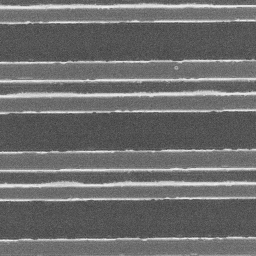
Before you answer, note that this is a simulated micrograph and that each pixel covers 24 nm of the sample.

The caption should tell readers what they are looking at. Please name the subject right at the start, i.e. lines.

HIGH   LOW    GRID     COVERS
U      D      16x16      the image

UUUUUUUUUUUUUUUU
DDDDDDDDDDDDDDDD
DDDDDDDDDDDDDDDD
DDDDDDDDDDDDDDDD
UUUUUUUUUUUUUUUU
UUUUUUUUUUUUUUUU
UUUUUUUUUUUUUUUU
DDDDDDDDDDDDDDDD
DDDDDDDDDDDDDDDD
DDDDDUUUUUUUUUUU
UUUUUUUUUUUUUUUU
UUUUUUUUUUUUUUUU
UDDDDDDDDDDDDDDD
DDDDDDDDDDDDDDDD
DDDDDDDDDDDDDDDD
UUUUUUUUUUUUUUUU